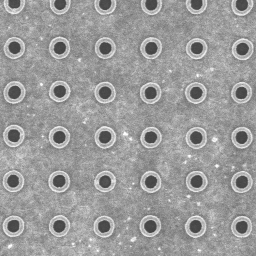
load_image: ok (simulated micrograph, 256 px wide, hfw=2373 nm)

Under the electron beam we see a regular array of ring-shaped raised bodies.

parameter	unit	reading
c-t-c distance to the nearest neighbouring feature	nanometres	410